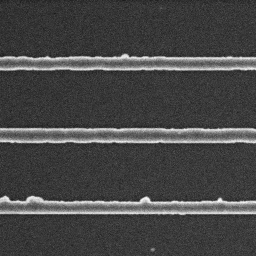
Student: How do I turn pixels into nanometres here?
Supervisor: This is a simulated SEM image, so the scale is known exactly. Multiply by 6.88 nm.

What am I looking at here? lines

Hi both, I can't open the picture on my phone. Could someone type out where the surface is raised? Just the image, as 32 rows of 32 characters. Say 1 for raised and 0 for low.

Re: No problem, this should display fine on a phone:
00000000000000000000000000000000
00000000000000000000000000000000
00000000000000000000000000000000
00000000000000000000000000000000
00000000000000000000000000000000
00000000000000000000000000000000
00000000000000000000000000000000
11111111111111111111111111111111
11111111111111111111111111111111
00000000000000000000000000000000
00000000000000000000000000000000
00000000000000000000000000000000
00000000000000000000000000000000
00000000000000000000000000000000
00000000000000000000000000000000
00000000000000000000000000000000
11111111111111111111111111111111
11111111111111111111111111111111
00000000000000000000000000000000
00000000000000000000000000000000
00000000000000000000000000000000
00000000000000000000000000000000
00000000000000000000000000000000
00000000000000000000000000000000
00000000000000000000000000000000
11111111111111111111111111111111
11111111111111111111111111111111
00000000000000000000000000000000
00000000000000000000000000000000
00000000000000000000000000000000
00000000000000000000000000000000
00000000000000000000000000000000